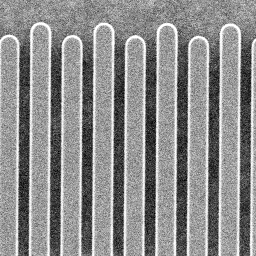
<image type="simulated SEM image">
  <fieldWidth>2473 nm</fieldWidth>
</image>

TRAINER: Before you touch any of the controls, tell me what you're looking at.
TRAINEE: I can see groups of lines, slits or small figures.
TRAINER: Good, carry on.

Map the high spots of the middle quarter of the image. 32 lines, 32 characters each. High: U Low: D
UUUUDDDUUUUUDDDUUUUUDDDUUUUUDDDU
UUUUDDDUUUUUDDDUUUUUDDDUUUUUDDDU
UUUUDDDUUUUUDDDUUUUUDDDUUUUUDDDU
UUUUDDDUUUUUDDDUUUUUDDDUUUUUDDDU
UUUUDDDUUUUUDDDUUUUUDDDUUUUUDDDU
UUUUDDDUUUUUDDDUUUUUDDDUUUUUDDDU
UUUUDDDUUUUUDDDUUUUUDDDUUUUUDDDU
UUUUDDDUUUUUDDDUUUUUDDDUUUUUDDDU
UUUUDDDUUUUUDDDUUUUUDDDUUUUUDDDU
UUUUDDDUUUUUDDDUUUUUDDDUUUUUDDDU
UUUUDDDUUUUUDDDUUUUUDDDUUUUUDDDU
UUUUDDDUUUUUDDDUUUUUDDDUUUUUDDDU
UUUUDDDUUUUUDDDUUUUUDDDUUUUUDDDU
UUUUDDDUUUUUDDDUUUUUDDDUUUUUDDDU
UUUUDDDUUUUUDDDUUUUUDDDUUUUUDDDU
UUUUDDDUUUUUDDDUUUUUDDDUUUUUDDDU
UUUUDDDUUUUUDDDUUUUUDDDUUUUUDDDU
UUUUDDDUUUUUDDDUUUUUDDDUUUUUDDDU
UUUUDDDUUUUUDDDUUUUUDDDUUUUUDDDU
UUUUDDDUUUUUDDDUUUUUDDDUUUUUDDDU
UUUUDDDUUUUUDDDUUUUUDDDUUUUUDDDU
UUUUDDDUUUUUDDDUUUUUDDDUUUUUDDDU
UUUUDDDUUUUUDDDUUUUUDDDUUUUUDDDU
UUUUDDDUUUUUDDDUUUUUDDDUUUUUDDDU
UUUUDDDUUUUUDDDUUUUUDDDUUUUUDDDU
UUUUDDDUUUUUDDDUUUUUDDDUUUUUDDDU
UUUUDDDUUUUUDDDUUUUUDDDUUUUUDDDU
UUUUDDDUUUUUDDDUUUUUDDDUUUUUDDDU
UUUUDDDUUUUUDDDUUUUUDDDUUUUUDDDU
UUUUDDDUUUUUDDDUUUUUDDDUUUUUDDDU
UUUUDDDUUUUUDDDUUUUUDDDUUUUUDDDU
UUUUDDDUUUUUDDDUUUUUDDDUUUUUDDDU